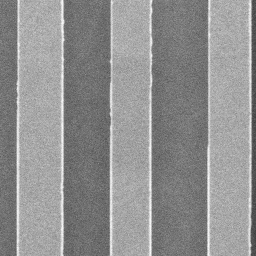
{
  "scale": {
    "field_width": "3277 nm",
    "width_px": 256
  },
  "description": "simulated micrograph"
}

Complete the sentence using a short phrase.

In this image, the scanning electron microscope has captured lines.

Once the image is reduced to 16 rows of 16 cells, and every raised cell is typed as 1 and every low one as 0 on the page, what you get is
0111000110000111
0111000110000111
0111000110000111
0111000110000111
0111000110000111
0111000110000111
0111000110000111
0111000110000111
0111000110000111
0111000110000111
0111000110000111
0111000110000111
0111000110000111
0111000110000111
0111000110000111
0111000110000111